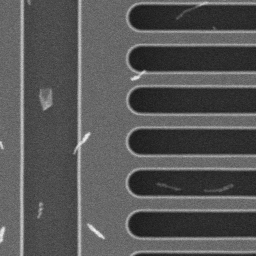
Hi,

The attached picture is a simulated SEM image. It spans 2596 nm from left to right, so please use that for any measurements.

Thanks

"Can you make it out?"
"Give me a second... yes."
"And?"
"groups of lines, slits or small figures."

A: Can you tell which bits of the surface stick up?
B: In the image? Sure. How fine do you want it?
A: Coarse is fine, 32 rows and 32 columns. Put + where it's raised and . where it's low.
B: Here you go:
+++.......++++++++......++......
+++.......++++++................
+++.......++++++................
+++.......+++++++...............
+++.......++++++++++++++++++++++
+++.......++++++++++++++++++++++
+++.......++++++................
+++.......++++++................
+++.......++++++................
+++.......++++++++++++++++++++++
+++.......++++++++++++++++++++++
+++.......++++++................
+++.......++++++................
+++.......++++++................
+++.......++++++++++++++++++++++
+++.......++++++++++++++++++++++
+++.......+++++++...............
+++.......++++++................
+++.......++++++................
+++.......++++++++++++++++++++++
+++.......++++++++++++++++++++++
+++.......+++++++...............
+++.......++++++................
+++.......++++++................
+++.......++++++++..............
+++.......++++++++++++++++++++++
+++.......+++++++...............
+++.......++++++................
+++.......++++++................
+++.......+++++++...............
+++.......++++++++++++++++++++++
+++.......++++++++++++++++++++++